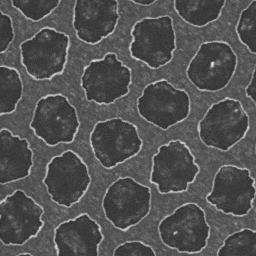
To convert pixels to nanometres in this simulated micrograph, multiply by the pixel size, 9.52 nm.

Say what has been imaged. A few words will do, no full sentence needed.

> a regular array of holes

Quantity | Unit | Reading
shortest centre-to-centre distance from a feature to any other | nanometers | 571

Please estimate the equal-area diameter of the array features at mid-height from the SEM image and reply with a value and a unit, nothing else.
451 nm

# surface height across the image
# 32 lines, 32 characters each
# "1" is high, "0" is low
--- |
11000001100000011101110000001110
11100011100000011111110000011100
01110111100000011100011000011100
00111111100000111000001111111100
00110000110001111000001111111100
01100000011111110000001110001110
11100000111111110000001110000111
11100000111110011100011100000011
01100000111000001111111100000111
00110001110000001111111100000111
00011111110000001110011100001110
00011111111000001100000111111110
00111000111000111000000011110111
00111000011111111000000011000011
11110000001111111100000111000001
11110000001100001110001110000001
01110000011100000111111110000001
00011100011000000011111110000011
00001111111100000011000111100111
00001111001100001110000011111111
00001100000110011110000011111111
00001100000111111110000001100001
00111100000111100110000011100000
11111100000111000011000111100000
10011100001110000001111111000000
00000111011110000001111011100001
00000111111110000001110001110001
00000111100011000011000000111111
00000110000011101111000000111111
00001110000001111111000000111000
11111110000011110011100000110000
11111110000011000001111011100000